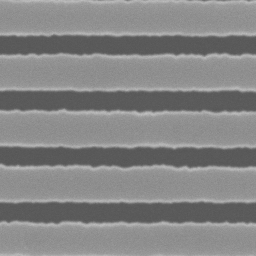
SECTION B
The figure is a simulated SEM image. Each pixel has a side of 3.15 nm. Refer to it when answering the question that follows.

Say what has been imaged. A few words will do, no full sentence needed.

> lines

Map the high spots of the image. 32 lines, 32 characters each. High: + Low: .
++++++++++++++++++++++++++++++++
++++++++++++++++++++++++++++++++
++++++++++++++++++++++++++++++++
++++++++++++++++++++++++++++++++
..+...........+....+...+++.+...+
................................
................................
++++++++++++++++++++++++++++++++
++++++++++++++++++++++++++++++++
++++++++++++++++++++++++++++++++
++++++++++++++++++++++++++++++++
................................
................................
................................
++++++++++++++++++++++++++++++++
++++++++++++++++++++++++++++++++
++++++++++++++++++++++++++++++++
++++++++++++++++++++++++++++++++
............................+...
................................
................................
++++++++++++++++++++++++++++++++
++++++++++++++++++++++++++++++++
++++++++++++++++++++++++++++++++
++++++++++++++++++++++++++++++++
................................
................................
................................
++++++++++++++++++++++++++++++++
++++++++++++++++++++++++++++++++
++++++++++++++++++++++++++++++++
++++++++++++++++++++++++++++++++